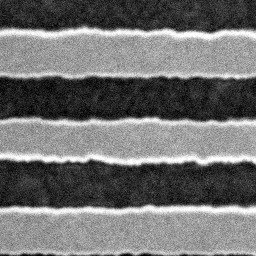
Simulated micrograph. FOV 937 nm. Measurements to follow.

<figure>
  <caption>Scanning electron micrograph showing lines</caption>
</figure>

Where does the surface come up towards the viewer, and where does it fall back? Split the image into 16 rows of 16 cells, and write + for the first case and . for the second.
................
................
++++++++++++++++
++++++++++++++++
++++++++++++++++
................
................
+++.....++......
++++++++++++++++
++++++++++++++++
................
................
................
++++++++++++++++
++++++++++++++++
++++++++++++++++